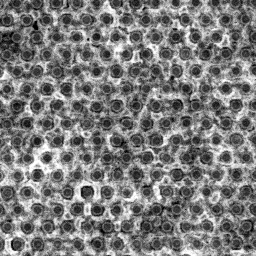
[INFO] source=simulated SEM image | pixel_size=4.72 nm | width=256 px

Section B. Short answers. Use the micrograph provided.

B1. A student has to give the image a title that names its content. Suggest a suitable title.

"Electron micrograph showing a regular array of raised bodies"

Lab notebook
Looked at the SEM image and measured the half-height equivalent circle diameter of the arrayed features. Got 45.5 nm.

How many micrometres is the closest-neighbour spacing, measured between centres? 0.0543